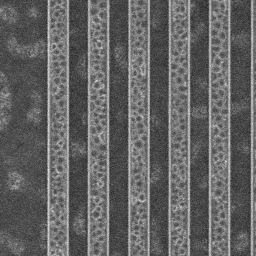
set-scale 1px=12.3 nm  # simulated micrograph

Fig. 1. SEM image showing parallel lines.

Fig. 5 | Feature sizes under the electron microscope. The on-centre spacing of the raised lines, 0.494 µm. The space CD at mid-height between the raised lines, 264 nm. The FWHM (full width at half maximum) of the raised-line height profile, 233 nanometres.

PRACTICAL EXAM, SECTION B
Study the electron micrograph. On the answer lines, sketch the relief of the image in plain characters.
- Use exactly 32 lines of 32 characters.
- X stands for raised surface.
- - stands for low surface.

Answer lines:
------XX---XX---XXX--XXX--XXX---
------XX---XX---XXX--XXX--XXX---
------XX---XX---XXX--XXX--XXX---
------XX---XX---XXX--XXX--XXX---
------XX---XX---XXX--XXX--XXX---
------XX---XX---XXX--XXX--XXX---
------XX---XX---XXX--XXX--XXX---
------XX---XX---XXX--XXX--XXX---
------XX---XX---XXX--XXX--XXX---
------XX---XX---XXX--XXX--XXX---
------XX---XX---XXX--XXX--XXX---
------XX---XX---XXX--XXX--XXX---
------XX---XX---XXX--XXX--XXX---
------XX---XX---XXX--XXX--XXX---
------XX---XX---XXX--XXX--XXX---
------XX---XX---XXX--XXX--XXX---
------XX---XX---XX---XXX--XXX---
------XX---XX---XX---XXX--XXX---
------XX---XX---XX---XXX--XXX---
------XX---XX---XX---XXX--XXX---
------XX---XX---XX---XXX--XXX---
------XX---XX---XX---XXX--XXX---
------XX---XX---XX---XXX--XXX---
------XX---XX---XX---XXX--XXX---
------XX---XX---XX---XXX--XXX---
------XX---XX---XX---XXX--XXX---
------XX---XX---XX---XXX--XXX---
------XX---XX---XX---XXX--XXX---
------XX---XX---XX---XXX--XXX---
------XX---XX---XX---XXX--XXX---
------XX---XX---XX---XXX--XXX--X
------XX---XX---XX---XXX--XXX--X